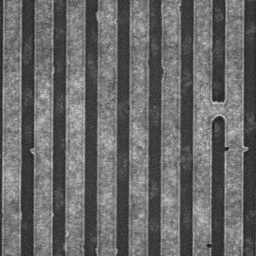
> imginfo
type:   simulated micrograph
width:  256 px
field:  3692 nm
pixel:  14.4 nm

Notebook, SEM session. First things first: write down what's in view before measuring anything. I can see parallel lines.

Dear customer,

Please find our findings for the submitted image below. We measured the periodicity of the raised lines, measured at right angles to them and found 458 nanometres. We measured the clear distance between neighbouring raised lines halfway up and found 13.1 pixels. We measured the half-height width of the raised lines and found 269 nm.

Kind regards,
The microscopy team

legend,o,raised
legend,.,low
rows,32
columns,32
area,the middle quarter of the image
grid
.oooo....oooo....oooo....oooo...
.oooo....oooo....oooo....oooo...
.oooo....oooo....oooo....oooo...
.oooo....oooo....oooo....oooo...
.oooo....oooo....oooo...ooooo...
.oooo....oooo....oooo...ooooo...
.oooo....oooo....oooo...ooooo...
.oooo....oooo....oooo...ooooo...
.oooo....oooo....oooo....oooo...
.oooo....oooo....oooo....oooo...
.oooo....oooo....oooo...ooooo...
.oooo....oooo....oooo...ooooo...
.oooo....oooo....oooo...ooooo...
.oooo....oooo....oooo...ooooo...
.oooo....oooo....oooo...ooooo...
.oooo....oooo....oooo...ooooo...
.oooo....oooo....oooo...ooooo...
.oooo....oooo....oooo...ooooo...
.oooo....oooo...ooooo...ooooo...
.oooo....oooo...ooooo...ooooo...
.oooo....oooo...ooooo...ooooo...
.oooo....oooo...ooooo...ooooo...
.oooo....oooo...ooooo...ooooo...
.oooo....oooo...ooooo...ooooo...
.oooo....oooo...ooooo...ooooo...
.oooo....oooo...ooooo...ooooo...
.oooo....oooo...ooooo...ooooo...
.oooo....oooo...ooooo...ooooo...
.oooo....oooo...ooooo...ooooo...
.oooo....oooo...ooooo...ooooo...
.oooo....oooo...ooooo...ooooo...
.oooo....oooo...ooooo...ooooo...